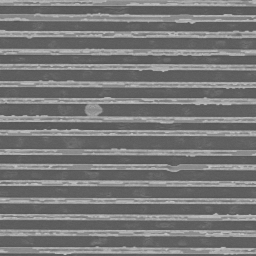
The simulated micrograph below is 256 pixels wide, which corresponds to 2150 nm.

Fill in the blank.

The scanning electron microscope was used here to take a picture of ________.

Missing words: parallel lines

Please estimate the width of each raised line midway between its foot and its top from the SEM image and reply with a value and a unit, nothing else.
49.3 nm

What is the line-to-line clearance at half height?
89.2 nm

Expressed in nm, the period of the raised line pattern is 139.